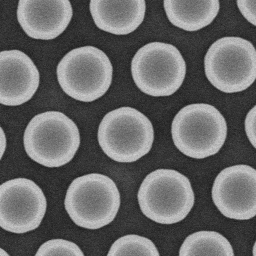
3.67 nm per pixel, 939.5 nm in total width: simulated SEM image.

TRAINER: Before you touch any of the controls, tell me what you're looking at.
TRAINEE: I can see an array of small figures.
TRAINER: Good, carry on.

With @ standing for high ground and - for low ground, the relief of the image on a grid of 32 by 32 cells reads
--@@@@@@@--@@@@@@@---@@@@@@---@@
--@@@@@@@--@@@@@@@---@@@@@@---@@
--@@@@@@@---@@@@@@---@@@@@@----@
---@@@@@----@@@@@------@@-------
----@@@-------------------------
-------------------@@------@@@@-
@@@------@@@@----@@@@@----@@@@@@
@@@@----@@@@@@---@@@@@@---@@@@@@
@@@@@--@@@@@@@--@@@@@@@---@@@@@@
@@@@@--@@@@@@@---@@@@@@---@@@@@@
@@@@@--@@@@@@@---@@@@@@---@@@@@-
@@@@----@@@@@-----@@@@------@---
@@@@------@@--------------------
---------------@-------@@@@-----
-----@@@-----@@@@@----@@@@@@---@
----@@@@@----@@@@@@---@@@@@@---@
---@@@@@@@--@@@@@@@--@@@@@@@---@
@--@@@@@@@--@@@@@@@---@@@@@@---@
@--@@@@@@@---@@@@@@---@@@@@@----
----@@@@@-----@@@@------@@------
-----@@@------------------------
-------------------@@@------@@@@
-@@@-----@@@@@----@@@@@@---@@@@@
@@@@@----@@@@@@--@@@@@@@---@@@@@
@@@@@@--@@@@@@@--@@@@@@@---@@@@@
@@@@@@--@@@@@@@--@@@@@@@---@@@@@
@@@@@@--@@@@@@@---@@@@@@----@@@@
@@@@@----@@@@@-----@@@@---------
@@@@-------@--------------------
----------------@-------@@@@----
-----@@@@-----@@@@@----@@@@@@---
@----@@@@@----@@@@@@--@@@@@@@---